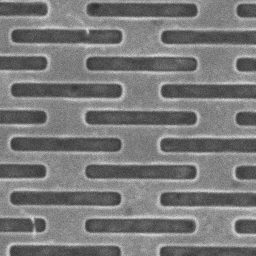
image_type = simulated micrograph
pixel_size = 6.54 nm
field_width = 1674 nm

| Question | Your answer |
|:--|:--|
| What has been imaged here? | groups of lines, slits or small figures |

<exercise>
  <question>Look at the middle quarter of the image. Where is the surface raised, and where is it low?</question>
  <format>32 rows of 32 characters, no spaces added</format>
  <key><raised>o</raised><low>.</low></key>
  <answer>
ooooo...........................
oooooo..........................
oooooooooooooooooooooooooooooooo
oooooooooooooooooooooooooooooooo
oooooooooooooooooooooooooooooooo
...............ooooooooo........
...............ooooooooo........
...............ooooooooo........
..............ooooooooooo.......
oooooooooooooooooooooooooooooooo
oooooooooooooooooooooooooooooooo
ooooo.......................oooo
ooooo...........................
ooooo...........................
ooooo...........................
ooooooooooooooo.................
oooooooooooooooooooooooooooooooo
oooooooooooooooooooooooooooooooo
.............oooooooooooo.......
..............oooooooooo........
...............ooooooooo........
..............oooooooooo........
oooooooooooooooooooooooooooooooo
oooooooooooooooooooooooooooooooo
oooooooooooooooooooooooooooooooo
oooooo..........................
ooooo...........................
ooooo...........................
oooooo..........................
oooooooooooooooooooooooooooooooo
oooooooooooooooooooooooooooooooo
oooooooooooooooooooooooooooooooo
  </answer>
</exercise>